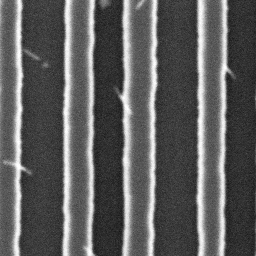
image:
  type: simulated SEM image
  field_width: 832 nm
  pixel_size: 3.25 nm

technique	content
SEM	lines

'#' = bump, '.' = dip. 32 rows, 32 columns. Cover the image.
###.....####....####.....###....
###.....####....####.....###....
###.....####...#####.....###....
###.....####...####......###....
###.....####....###......###....
##......####....####.....###....
###.....####....###......###....
###.....####....###......###....
###.....####....###......###....
###.....####....###......###....
###.....####....####.....###....
###.....####...####......###....
###.....####...####......###....
###.....####....###......###....
###.....####....###......###....
##......####....###......###....
##......####....###......###....
##......####....###......###....
##......####....###......###....
##......####....###......###....
##......####....###......###....
###.....####....###......###....
##......####....###......###....
##......####....###......###....
###.....####....###......###....
##......####....###......###....
##......####....###......###....
##......####....###......###....
##......###.....###......###....
##......###.....###......###....
##......###.....###......###....
##......####....###......###....